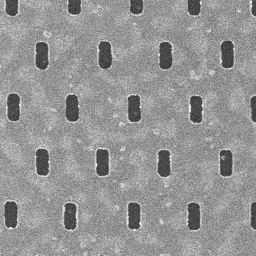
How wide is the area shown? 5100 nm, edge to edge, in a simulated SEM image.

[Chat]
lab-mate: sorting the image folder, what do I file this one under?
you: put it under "a regular array of holes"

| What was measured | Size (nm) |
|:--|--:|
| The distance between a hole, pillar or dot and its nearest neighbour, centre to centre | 1200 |